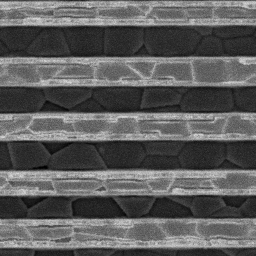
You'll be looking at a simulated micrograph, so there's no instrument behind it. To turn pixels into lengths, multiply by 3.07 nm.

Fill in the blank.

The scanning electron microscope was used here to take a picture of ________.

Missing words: parallel lines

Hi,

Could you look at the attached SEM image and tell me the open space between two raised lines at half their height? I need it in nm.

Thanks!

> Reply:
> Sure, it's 93.6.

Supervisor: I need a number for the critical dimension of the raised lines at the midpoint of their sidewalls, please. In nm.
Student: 81.5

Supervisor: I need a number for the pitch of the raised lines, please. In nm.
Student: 169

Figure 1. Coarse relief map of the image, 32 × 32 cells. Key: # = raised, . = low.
################################
################################
################################
................................
................................
................................
................................
################################
################################
################################
################################
................................
................................
................................
################################
################################
################################
................................
................................
................................
................................
............................####
################################
################################
................................
................................
................................
.............###################
################################
################################
################################
................................